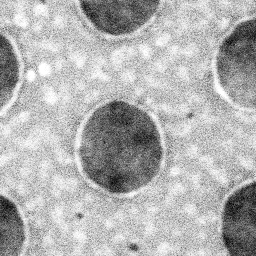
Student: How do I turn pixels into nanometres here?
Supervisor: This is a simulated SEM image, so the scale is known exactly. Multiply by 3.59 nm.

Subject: raised bodies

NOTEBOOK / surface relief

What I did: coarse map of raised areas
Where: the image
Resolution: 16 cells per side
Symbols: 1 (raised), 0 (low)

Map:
0000011111000000
0000001110000001
1000000000000011
1000000000000111
1100000000000111
1000000000000011
1000001110000001
0000011111000000
0000011111000000
0000011111000000
0000011111000000
0000001110000001
1000000000000011
1000000000000011
1100000000000011
1100000000000011